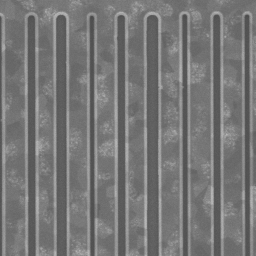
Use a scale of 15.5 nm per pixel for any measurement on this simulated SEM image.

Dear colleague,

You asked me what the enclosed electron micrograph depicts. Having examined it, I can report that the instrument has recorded parallel lines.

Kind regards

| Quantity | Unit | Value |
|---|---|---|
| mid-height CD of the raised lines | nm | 336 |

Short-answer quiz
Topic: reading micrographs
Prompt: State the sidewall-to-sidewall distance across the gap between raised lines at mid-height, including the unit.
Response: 148 nm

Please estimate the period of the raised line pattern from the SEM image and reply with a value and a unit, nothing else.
483 nanometers